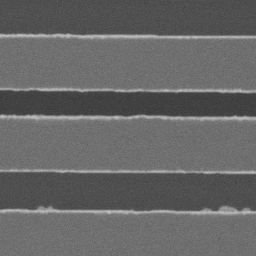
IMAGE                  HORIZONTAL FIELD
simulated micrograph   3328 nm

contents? lines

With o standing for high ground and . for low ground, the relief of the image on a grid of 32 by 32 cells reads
................................
................................
................................
................................
oooooooooooooooooooo............
oooooooooooooooooooooooooooooooo
oooooooooooooooooooooooooooooooo
oooooooooooooooooooooooooooooooo
oooooooooooooooooooooooooooooooo
oooooooooooooooooooooooooooooooo
oooooooooooooooooooooooooooooooo
......................o....ooooo
................................
................................
oo.ooo...........o..............
oooooooooooooooooooooooooooooooo
oooooooooooooooooooooooooooooooo
oooooooooooooooooooooooooooooooo
oooooooooooooooooooooooooooooooo
oooooooooooooooooooooooooooooooo
oooooooooooooooooooooooooooooooo
.......ooooooooooooooooooooooooo
................................
................................
................................
................................
oooooooooooooooooooooooooooooooo
oooooooooooooooooooooooooooooooo
oooooooooooooooooooooooooooooooo
oooooooooooooooooooooooooooooooo
oooooooooooooooooooooooooooooooo
oooooooooooooooooooooooooooooooo